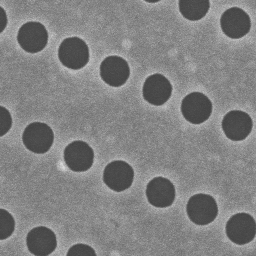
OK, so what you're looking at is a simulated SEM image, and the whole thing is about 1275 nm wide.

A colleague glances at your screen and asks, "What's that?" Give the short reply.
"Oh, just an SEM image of a regular array of holes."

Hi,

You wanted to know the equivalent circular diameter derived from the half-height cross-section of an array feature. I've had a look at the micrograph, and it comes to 156 nm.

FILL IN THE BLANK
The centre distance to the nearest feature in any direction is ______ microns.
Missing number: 0.22